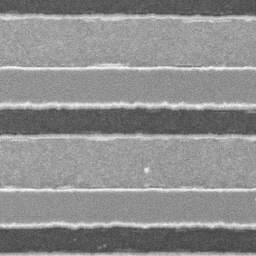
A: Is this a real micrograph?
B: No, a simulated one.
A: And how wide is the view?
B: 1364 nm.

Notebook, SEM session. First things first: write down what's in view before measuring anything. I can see lines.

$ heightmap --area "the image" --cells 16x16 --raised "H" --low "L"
LLLLLLLLLLLLLLLL
HHHHHHHHHHHHHHHH
HHHHHHHHHHHHHHHH
HHHHHHHHHHHHHHHH
HHHHHHHHHHHHHHHH
HHHHHHHHHHHHHHHH
HHHHHHHHHHHHHHHH
LLLLLLLLLLLLLLLL
LLLLLLLLLLLLLLLL
HHHHHHHHHHHHHHHH
HHHHHHHHHHHHHHHH
HHHHHHHHHHHHHHHH
HHHHHHHHHHHHHHHH
HHHHHHHHHHHHHHHH
LLLLLLLLLLLLLLLL
LLLLLLLLLLLLLLLL